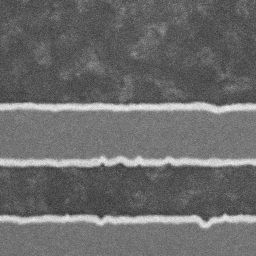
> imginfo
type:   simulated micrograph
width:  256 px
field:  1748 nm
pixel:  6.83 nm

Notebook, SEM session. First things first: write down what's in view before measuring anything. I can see one or a few lines or trenches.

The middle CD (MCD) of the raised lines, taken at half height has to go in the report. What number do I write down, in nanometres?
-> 378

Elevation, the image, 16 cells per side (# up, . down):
................
................
................
................
................
................
................
################
################
################
................
................
................
................
################
################